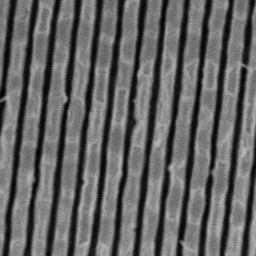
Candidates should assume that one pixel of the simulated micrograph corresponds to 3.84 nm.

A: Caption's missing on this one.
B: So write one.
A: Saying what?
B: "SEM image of parallel lines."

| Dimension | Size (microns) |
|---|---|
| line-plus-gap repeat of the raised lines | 0.0829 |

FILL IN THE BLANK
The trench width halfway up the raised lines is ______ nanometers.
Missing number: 25.2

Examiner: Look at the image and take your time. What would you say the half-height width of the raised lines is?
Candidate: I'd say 57.7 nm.